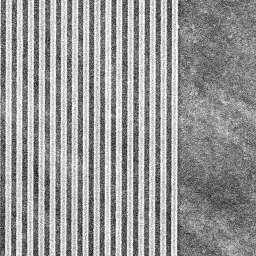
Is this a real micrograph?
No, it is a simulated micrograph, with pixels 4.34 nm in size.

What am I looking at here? parallel lines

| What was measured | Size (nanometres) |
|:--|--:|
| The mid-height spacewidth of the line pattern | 25.5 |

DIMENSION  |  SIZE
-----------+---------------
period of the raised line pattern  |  48.1 nm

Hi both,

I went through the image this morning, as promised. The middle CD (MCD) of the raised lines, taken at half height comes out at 21.7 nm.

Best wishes